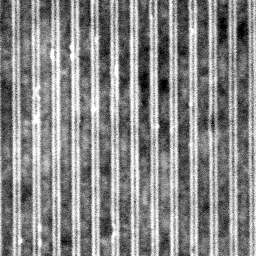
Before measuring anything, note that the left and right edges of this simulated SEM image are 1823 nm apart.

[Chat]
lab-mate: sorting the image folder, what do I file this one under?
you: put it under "parallel lines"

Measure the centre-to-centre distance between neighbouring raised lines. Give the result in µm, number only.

0.14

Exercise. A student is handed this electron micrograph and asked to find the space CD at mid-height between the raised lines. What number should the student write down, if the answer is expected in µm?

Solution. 0.0997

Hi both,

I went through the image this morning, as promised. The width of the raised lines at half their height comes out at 40.1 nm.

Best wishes